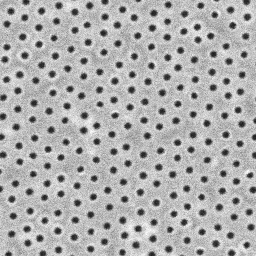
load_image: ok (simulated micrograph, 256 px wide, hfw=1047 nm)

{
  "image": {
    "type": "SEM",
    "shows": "a regular array of holes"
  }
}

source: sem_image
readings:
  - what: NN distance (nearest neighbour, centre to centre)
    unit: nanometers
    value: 64.7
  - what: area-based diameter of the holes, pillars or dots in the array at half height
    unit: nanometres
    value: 28.8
